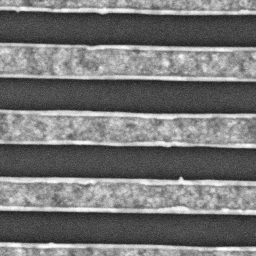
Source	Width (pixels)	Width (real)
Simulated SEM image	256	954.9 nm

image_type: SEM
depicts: one or a few lines or trenches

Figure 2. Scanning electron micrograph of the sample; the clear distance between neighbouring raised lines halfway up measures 0.128 µm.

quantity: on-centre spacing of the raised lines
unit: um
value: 0.248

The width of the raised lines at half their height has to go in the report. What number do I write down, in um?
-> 0.118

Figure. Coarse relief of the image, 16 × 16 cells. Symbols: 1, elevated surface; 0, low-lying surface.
1111111111111111
0000000000000000
0000000000000000
1111111111111111
1111111111111111
0000000000000000
0000000000000000
1111111111111111
1111111111111111
0000000000000000
0000000000000000
1111111111111111
1111111111111111
0000000000000000
0000000000000000
1111111111100100